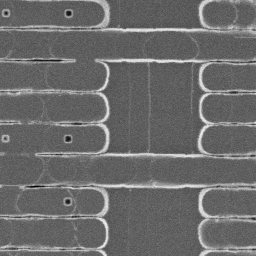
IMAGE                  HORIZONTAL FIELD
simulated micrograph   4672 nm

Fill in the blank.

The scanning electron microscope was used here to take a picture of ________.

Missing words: wiring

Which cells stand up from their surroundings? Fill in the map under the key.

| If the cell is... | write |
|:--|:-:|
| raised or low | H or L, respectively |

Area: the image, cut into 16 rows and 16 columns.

HHHHHHHLLLLLLHHH
HHHHHHHLLLLLLHHH
HHHHHHHHHHHHHHHH
HHHHHHHHHHHHHHHH
HHHHHHHLLLLLLHHH
HHHHHHLLLLLLLHHH
HHHHHHHLLLLLLHHH
HHHHHHHLLLLLLHHH
HHHHHHHLLLLLLHHH
HHHHHHHLLLLLHHHH
HHHHHHHHHHHHHHHH
HHHHHHHHHHHHHHHH
HHHHHHHLLLLLLHHH
HHHHHHLLLLLLLHHH
HHHHHHHLLLLLLHHH
HHHHHHLLLLLLLHHH